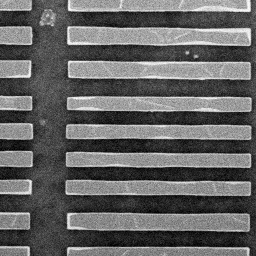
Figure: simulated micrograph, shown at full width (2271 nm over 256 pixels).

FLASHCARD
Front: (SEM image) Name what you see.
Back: groups of lines, slits or small figures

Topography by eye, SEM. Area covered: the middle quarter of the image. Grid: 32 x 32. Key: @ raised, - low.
-@@@@@@@@@@@@@@@@@@@@@@@@@@@@@@@
-@@@@@@@@@@@@@@@@@@@@@@@@@@@@@@@
-@@@@@@@@@@@@@@@@@@@@@@@@@@@@@@@
-----------------------------@@@
--------------------------------
--------------------------------
--------------------------------
--------------------------------
-@@@-@@@@@@@@@@@@@@@@@@@@@@@@@@@
-@@@@@@@@@@@@@@@@@@@@@@@@@@@@@@@
-@@@@@@@@@@@@@@@@@@@@@@@@@@@@@@@
------------@@@@@@@@@@@@@@@@@@@@
--------------------------------
--------------------------------
--------------------------------
-@@@@@@@@@@@@@@@@@@@@@@@@@@@@@@@
-@@@@@@@@@@@@@@@@@@@@@@@@@@@@@@@
-@@@@@@@@@@@@@@@@@@@@@@@@@@@@@@@
--@@@@@@--@@---------@-----@@@@@
--------------------------------
--------------------------------
--------------------------------
-@@@@@@@@@@@@@@@@@@@@@@@@@--@@--
-@@@@@@@@@@@@@@@@@@@@@@@@@@@@@@@
-@@@@@@@@@@@@@@@@@@@@@@@@@@@@@@@
----@@----------@@@@@@@@@@@--@@@
--------------------------------
--------------------------------
--------------------------------
-@@@@@@@@@@@@@@@@@@@@@@@@@------
-@@@@@@@@@@@@@@@@@@@@@@@@@@@@@@@
-@@@@@@@@@@@@@@@@@@@@@@@@@@@@@@@